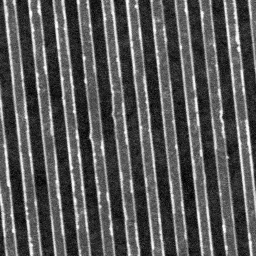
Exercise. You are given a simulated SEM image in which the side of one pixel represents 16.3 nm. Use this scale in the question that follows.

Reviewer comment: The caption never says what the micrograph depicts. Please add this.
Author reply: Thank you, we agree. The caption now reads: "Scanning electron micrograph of parallel lines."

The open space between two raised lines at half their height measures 221 nm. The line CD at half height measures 180 nm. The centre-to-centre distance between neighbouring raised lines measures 0.396 microns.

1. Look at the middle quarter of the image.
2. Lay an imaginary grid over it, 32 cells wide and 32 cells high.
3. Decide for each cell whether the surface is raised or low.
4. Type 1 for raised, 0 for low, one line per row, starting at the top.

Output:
10000111000111000111000111000011
11000111000111000111000011000011
11000111000111000111000011000011
11000111000011000011000011000011
11000111000011000011000011100011
11000011000011000011000011100011
11000011000011100011100011100011
11000011000011100011100011100011
11000011100011100011100011100001
11000011100011100011100011100001
11100011100011100001100001100001
11100011100011100001100001100001
11100011100011100001100001100001
11100011100011100001100001100001
01100001100001100001100001110001
01100001100001100001100001110001
01100001100001110001110001110001
01100001100001110001110001110001
01110001110001110001110001110000
01110001110001110001110001110000
01110001110001110001110000110000
01110001110001110001110000110000
01110001110000110000110000110000
01110000110000110000110000110000
01110000110000110000110000111000
00110000110000111000111000111000
00110000110000111000111000111000
00110000111000111000111000111000
00110000111000111000111000111000
00111000111000111000011000011000
00111000111000111000011000011000
00111000111000011000011000011000